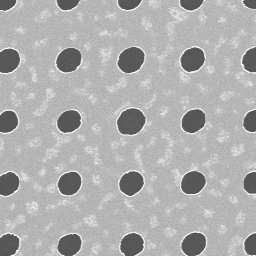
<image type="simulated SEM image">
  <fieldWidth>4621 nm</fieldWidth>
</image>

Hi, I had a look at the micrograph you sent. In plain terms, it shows a regular array of holes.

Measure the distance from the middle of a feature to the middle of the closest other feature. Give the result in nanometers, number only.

1110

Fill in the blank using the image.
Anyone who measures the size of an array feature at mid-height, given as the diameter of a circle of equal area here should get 436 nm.